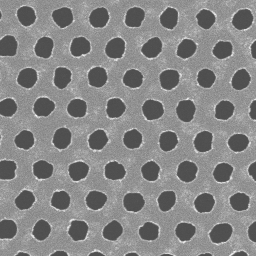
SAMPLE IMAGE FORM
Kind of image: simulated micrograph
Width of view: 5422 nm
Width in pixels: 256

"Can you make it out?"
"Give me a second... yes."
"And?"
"a regular array of holes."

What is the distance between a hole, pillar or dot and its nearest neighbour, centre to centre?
724 nm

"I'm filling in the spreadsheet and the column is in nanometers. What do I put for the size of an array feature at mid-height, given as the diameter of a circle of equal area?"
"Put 417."